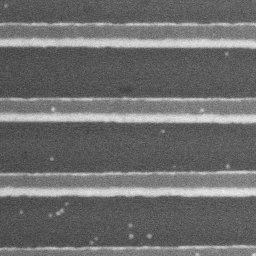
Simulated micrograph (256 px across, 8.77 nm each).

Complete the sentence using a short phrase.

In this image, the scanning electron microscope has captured lines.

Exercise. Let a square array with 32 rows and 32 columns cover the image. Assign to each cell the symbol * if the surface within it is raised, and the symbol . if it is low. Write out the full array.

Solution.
................................
................................
................................
********************************
********************************
.....***************************
................................
................................
................................
................................
................................
................................
********************************
********************************
********************************
................................
................................
................................
................................
................................
................................
........................*..*****
********************************
********************************
................................
................................
................................
................................
................................
................................
................................
********************************